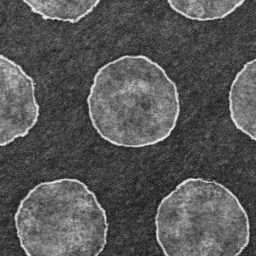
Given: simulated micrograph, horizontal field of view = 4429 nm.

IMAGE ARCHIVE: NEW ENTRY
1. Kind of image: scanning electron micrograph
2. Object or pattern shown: raised bodies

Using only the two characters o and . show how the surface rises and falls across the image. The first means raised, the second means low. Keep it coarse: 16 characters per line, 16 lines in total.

..oooo.....oooo.
................
................
................
o.....oooo.....o
oo....ooooo....o
oo....ooooo...oo
oo....ooooo....o
o......ooo......
................
................
...oo......ooo..
..oooo....ooooo.
.oooooo...ooooo.
.oooooo...oooooo
..oooo....ooooo.